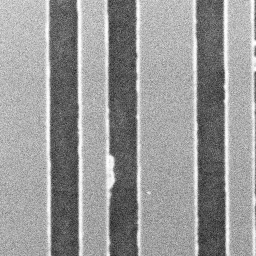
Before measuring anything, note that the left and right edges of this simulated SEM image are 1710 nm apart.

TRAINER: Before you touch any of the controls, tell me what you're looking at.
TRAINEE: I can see lines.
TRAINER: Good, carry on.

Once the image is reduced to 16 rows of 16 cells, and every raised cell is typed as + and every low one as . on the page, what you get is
+++..++..+++..++
+++..++..+++..++
+++..++..+++..++
+++..++..+++..++
+++..++..+++..++
+++..++..+++..++
+++..++..+++..++
+++..++..+++..++
+++..++..+++..++
+++..++..+++..++
+++..++..+++..++
+++..++..+++..++
+++..++..+++..++
+++..++..+++..++
+++..++..+++..++
+++..++..+++..++